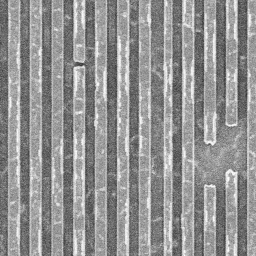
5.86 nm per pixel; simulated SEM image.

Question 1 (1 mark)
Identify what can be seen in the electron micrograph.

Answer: parallel lines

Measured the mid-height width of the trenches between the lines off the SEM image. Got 10.9 pixels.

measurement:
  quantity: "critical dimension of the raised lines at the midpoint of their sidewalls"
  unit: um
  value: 0.0645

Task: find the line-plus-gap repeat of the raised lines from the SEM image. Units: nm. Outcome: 128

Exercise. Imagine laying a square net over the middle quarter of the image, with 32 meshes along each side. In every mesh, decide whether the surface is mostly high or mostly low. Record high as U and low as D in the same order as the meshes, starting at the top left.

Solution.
DDDDDDDDUUDDDUUUDDDUUDDDDUUDDDUU
DDUUUDDDUUDDDUUUDDDUUDDDDUUDDDUU
DDUUUDDDUUDDDUUUDDDUUDDDDUUDDDUU
DDUUUDDDUUDDDUUUDDDUUDDDDUUDDDUU
DDUUUDDDUUDDDUUUDDDUUDDDDUUDDDUU
DDUUUDDDUUDDDUUUDDDUUDDDDUUDDDUU
DDUUUDDDUUDDDUUUDDDUUDDDDUUDDDUU
DDUUUDDDUUDDDUUUDDDUUDDDDUUDDDUU
DDUUUDDDUUDDDUUUDDDUUDDDDUUDDDUU
DDUUUDDDUUDDDUUUDDDUUDDDDUUDDDUU
DDUUUDDDUUDDDUUUDDDUUDDDDUUDDDUU
DDUUUDDDUUDDDUUUDDDUUDDDDUUDDDUU
DDUUUDDDUUDDDUUUDDDUUDDDDUUDDDUU
DDUUUDDDUUDDDUUUDDDUUDDDDUUDDDUU
DDUUUDDDUUDDDUUUDDDUUDDDDUUDDDUU
DDUUUDDDUUDDDUUUDDDUUDDDDUUDDDUU
DDUUUDDDUUDDDUUUDDDUUDDDDUUDDDUU
DDUUUDDDUUDDDUUUDDDUUDDDDUUDDDUU
DDUUUDDDUUDDDUUUDDDUUDDDDUUDDDUU
DDUUUDDDUUDDDUUUDDDUUDDDDUUDDDUU
DDUUUDDDUUDDDUUUDDDUUDDDDUUDDDUU
DDUUUDDDUUDDDUUUDDDUUDDDDUUDDDUU
DDUUUDDDUUUDDUUUDDDUUDDDDUUDDDUU
DDUUUDDDUUUDDUUUDDDUUDDDDUUDDDUU
DDUUUDDDUUUDDUUUDDDUUDDDDUUDDDUU
DDUUUDDDUUUDDUUUDDDUUDDDDUUDDDUU
DDUUUDDDUUUDDUUUDDDUUDDDDUUDDDUU
DDUUUDDDUUUDDUUUDDDUUDDDDUUDDDUU
DDUUUDDDUUDDDUUUDDDUUDDDDUUDDDUU
DDUUUDDDUUDDDUUUDDDUUDDDDUUDDDUU
DDUUUDDDUUDDDUUUDDDUUDDDDUUDDDUU
DDUUUDDDUUDDDUUUDDDUUDDDDUUDDDUU